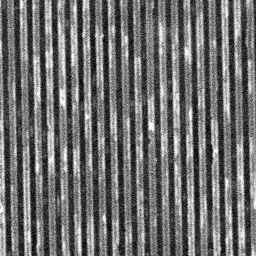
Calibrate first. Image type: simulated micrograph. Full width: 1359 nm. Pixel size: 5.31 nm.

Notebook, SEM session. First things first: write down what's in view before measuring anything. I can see parallel lines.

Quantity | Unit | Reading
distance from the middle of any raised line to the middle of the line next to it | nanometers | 66.9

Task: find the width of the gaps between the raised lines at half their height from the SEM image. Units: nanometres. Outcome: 35.9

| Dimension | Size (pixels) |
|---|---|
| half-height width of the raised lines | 5.88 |